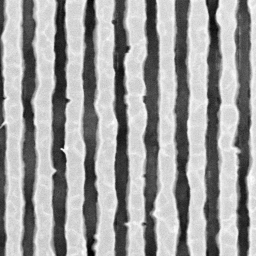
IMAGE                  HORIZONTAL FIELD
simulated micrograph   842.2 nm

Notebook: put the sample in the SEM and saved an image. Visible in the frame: parallel lines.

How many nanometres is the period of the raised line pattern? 101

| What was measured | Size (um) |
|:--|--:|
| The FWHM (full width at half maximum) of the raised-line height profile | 0.0567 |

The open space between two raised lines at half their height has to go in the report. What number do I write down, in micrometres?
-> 0.044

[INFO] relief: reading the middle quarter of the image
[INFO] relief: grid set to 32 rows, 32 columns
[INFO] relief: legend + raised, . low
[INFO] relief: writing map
.++++...++++...+++++....++++...+
+++++...+++++..+++++....++++...+
.++++...+++++..+++++....++++...+
.++++....++++..+++++....++++...+
.++++...+++++..+++++....++++...+
.++++...+++++..+++++....++++....
.++++....++++...++++....++++....
.++++...+++++...++++....++++....
.++++...+++++..+++++....++++....
.++++...++++....++++....++++....
.++++...++++....++++....++++...+
+++++...++++....+++++...+++....+
+++++...+++++...+++++...+++....+
.++++....++++...+++++...++++...+
++++.....++++...+++++...++++...+
++++.....++++...+++++...++++...+
++++.....++++...++++....++++...+
++++.....++++...++++....++++...+
+++++....++++...++++....+++....+
+++++....++++...++++....++++...+
+++++....++++...++++....++++....
+++++...+++++...++++....++++....
+++++...+++++...++++....++++....
+++++...+++++...++++....++++...+
.++++...+++++...++++....++++...+
.++++...++++....++++....++++...+
+++++...+++++...++++....++++...+
+++++...+++++...++++....++++...+
+++++...+++++...++++....++++...+
.++++...+++++...++++....++++...+
.++++...+++++...++++....++++....
.++++...+++++...++++....+++.....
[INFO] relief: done